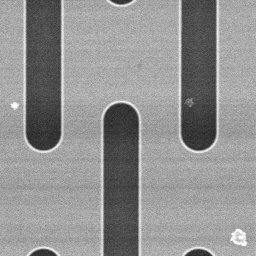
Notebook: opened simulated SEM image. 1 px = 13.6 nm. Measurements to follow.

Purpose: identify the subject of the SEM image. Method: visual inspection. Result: groups of lines, slits or small figures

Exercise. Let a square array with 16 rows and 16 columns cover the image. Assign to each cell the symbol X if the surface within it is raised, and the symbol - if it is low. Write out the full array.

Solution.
XX--XXXXXXX---XX
XX--XXXXXXX---XX
XX--XXXXXXX---XX
XX--XXXXXXX---XX
XX--XXXXXXX---XX
XX--XXXXXXX---XX
XX--XXX-XXX---XX
XX--XX---XX---XX
XX--XX---XX--XXX
XXXXXX---XXXXXXX
XXXXXX---XXXXXXX
XXXXXX---XXXXXXX
XXXXXX---XXXXXXX
XXXXXX---XXXXXXX
XXXXXX---XXXXXXX
XXXXXX---XXXXXXX